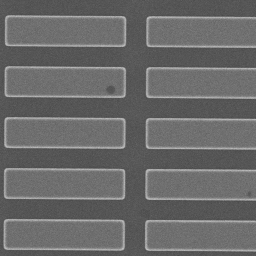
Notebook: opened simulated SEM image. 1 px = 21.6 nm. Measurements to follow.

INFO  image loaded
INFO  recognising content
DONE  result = groups of lines, slits or small figures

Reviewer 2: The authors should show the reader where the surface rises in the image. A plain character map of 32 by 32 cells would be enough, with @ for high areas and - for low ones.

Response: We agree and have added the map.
--------------------------------
--------------------------------
-@@@@@@@@@@@@@@@--@@@@@@@@@@@@@@
-@@@@@@@@@@@@@@@--@@@@@@@@@@@@@@
-@@@@@@@@@@@@@@@--@@@@@@@@@@@@@@
-@@@@@@@@@@@@@@@--@@@@@@@@@@@@@@
--------------------------------
--------------------------------
-@@@@@@@@@@@@@@-----------------
-@@@@@@@@@@@@@@@--@@@@@@@@@@@@@@
-@@@@@@@@@@@@@@@--@@@@@@@@@@@@@@
-@@@@@@@@@@@@@@@--@@@@@@@@@@@@@@
--------------------------------
--------------------------------
--------------------------------
-@@@@@@@@@@@@@@@--@@@@@@@@@@@@@@
-@@@@@@@@@@@@@@@--@@@@@@@@@@@@@@
-@@@@@@@@@@@@@@@--@@@@@@@@@@@@@@
-------------------@@@@@@@@@@@@@
--------------------------------
--------------------------------
-@@@@@@@@@@@@@@---@@@@@@@@@@@@@@
-@@@@@@@@@@@@@@@--@@@@@@@@@@@@@@
-@@@@@@@@@@@@@@@--@@@@@@@@@@@@@@
-@@@@@@@@@@@@@@---@@@@@@@@@@@@@@
--------------------------------
--------------------------------
-@@-----------------------------
-@@@@@@@@@@@@@@---@@@@@@@@@@@@@@
-@@@@@@@@@@@@@@---@@@@@@@@@@@@@@
-@@@@@@@@@@@@@@---@@@@@@@@@@@@@@
--------------------------------